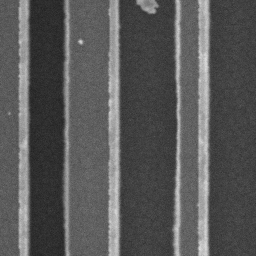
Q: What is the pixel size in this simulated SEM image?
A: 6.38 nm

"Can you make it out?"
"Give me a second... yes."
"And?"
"lines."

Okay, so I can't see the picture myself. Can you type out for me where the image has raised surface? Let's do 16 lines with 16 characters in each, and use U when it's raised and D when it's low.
UUDDUUUDDDDUUDDD
UUDDUUUDDDDUUDDD
UUDDUUUDDDDUUDDD
UUDDUUUDDDDUUDDD
UUDDUUUDDDDUUDDD
UUDDUUUDDDDUUDDD
UUDDUUUDDDDUUDDD
UUDDUUUDDDDUUDDD
UUDDUUUDDDDUUDDD
UUDDUUUDDDDUUDDD
UUDDUUUDDDDUUDDD
UUDDUUUDDDDUUDDD
UUDDUUUDDDDUUDDD
UUDDUUUDDDDUUDDD
UUDDUUUDDDDUUDDD
UUDDUUUDDDDUUDDD